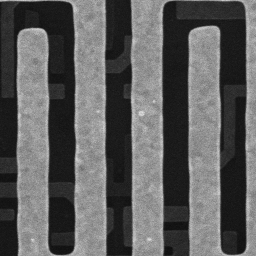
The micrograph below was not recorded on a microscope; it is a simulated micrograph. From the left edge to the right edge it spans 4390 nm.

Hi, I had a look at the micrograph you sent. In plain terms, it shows wiring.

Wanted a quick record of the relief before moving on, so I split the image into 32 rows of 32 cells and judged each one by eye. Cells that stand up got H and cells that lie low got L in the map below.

LLLLLLLLLHHHHLLLHHHHHLLLLLLLLLHH
LLLLLLLLLHHHHLLLLHHHLLLLLLLLLLLH
LLLLLLLLLHHHHLLLLHHHLLLLLLLLLLLH
LLLLLLLLLHHHHLLLLHHHLLLLLHHLLLLH
LLHHHHLLLHHHHLLLLHHHLLLLHHHLLLLH
LLHHHHLLLHHHHLLLLHHHLLLLHHHLLLLH
LLHHHHLLLHHHHLLLHHHHLLLLHHHLLLLH
LLHHHHLLLHHHHLLLHHHHLLLLHHHLLLLH
LLHHHHLLLHHHHLLLLHHHLLLLHHHLLLLH
LLHHHHLLLHHHHLLLLHHHLLLLHHHLLLLH
LLHHHHLLLLHHHLLLLHHHLLLLHHHLLLLH
LLHHHHLLLHHHHLLLHHHHLLLLHHHLLLLH
LLHHHHLLLHHHHLLLHHHHLLLLHHHHLLLH
LLHHHHLLLHHHHLLLLHHHLLLLHHHHLLLH
LLHHHHLLLHHHHLLLLHHHLLLLHHHHLLLH
LLHHHHLLLHHHHLLLLHHHLLLLHHHHLLLH
LLHHHHLLLHHHHLLLLHHHLLLLHHHHLLLH
LLHHHHLLLLHHHLLLLHHHLLLLHHHLLLLH
LLHHHHLLLLHHHLLLLHHHLLLLHHHLLLLH
LLHHHHLLLHHHHLLLLHHHLLLLHHHLLLLH
LLHHHHLLLHHHHLLLLHHHLLLLHHHLLLLH
LLHHHHLLLHHHHLLLLHHHLLLLHHHLLLLH
LLHHHHLLLLHHHLLLLHHHLLLLHHHLLLLH
LLHHHHLLLHHHHLLLLHHHLLLLHHHLLLLH
LLHHHHLLLHHHHLLLLHHHLLLLHHHLLLLH
LLHHHHLLLHHHHLLLLHHHLLLLHHHLLLLH
LLHHHHLLLHHHHLLLLHHHLLLLHHHLLLLH
LLHHHHLLLLHHHLLLLHHHLLLLHHHLLLLH
LLHHHHLLLHHHHLLLLHHHLLLLHHHLLLLH
LLHHHHLLLHHHHLLLLHHHLLLLHHHHLLLH
LLHHHHLLLHHHHLLLLHHHLLLLHHHHLLLH
LLHHHHLLLHHHHLLLLHHHLLLLHHHHLLHH